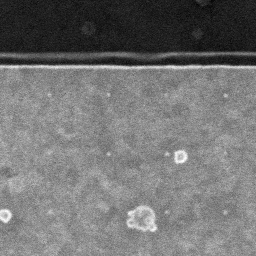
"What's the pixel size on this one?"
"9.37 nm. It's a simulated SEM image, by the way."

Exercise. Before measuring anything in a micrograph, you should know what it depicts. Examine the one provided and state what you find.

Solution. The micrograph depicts wiring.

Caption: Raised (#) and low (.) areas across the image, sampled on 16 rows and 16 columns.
................
................
................
................
################
################
################
################
################
################
################
################
################
################
################
################